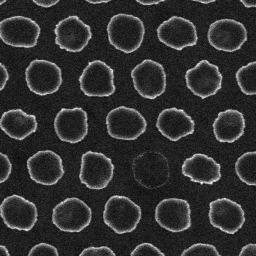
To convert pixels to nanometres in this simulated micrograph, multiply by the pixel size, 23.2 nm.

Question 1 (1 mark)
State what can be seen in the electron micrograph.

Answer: a regular array of raised bodies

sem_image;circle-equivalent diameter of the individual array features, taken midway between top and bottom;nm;806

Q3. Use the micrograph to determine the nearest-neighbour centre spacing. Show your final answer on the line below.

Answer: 1170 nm